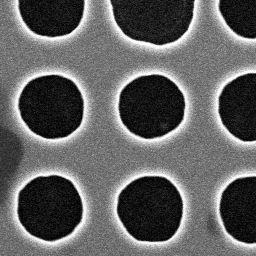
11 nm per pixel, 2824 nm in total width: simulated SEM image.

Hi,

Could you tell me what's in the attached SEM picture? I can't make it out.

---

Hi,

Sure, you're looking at holes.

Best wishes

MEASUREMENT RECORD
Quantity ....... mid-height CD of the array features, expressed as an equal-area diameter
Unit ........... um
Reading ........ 0.734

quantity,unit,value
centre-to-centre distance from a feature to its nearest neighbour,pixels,100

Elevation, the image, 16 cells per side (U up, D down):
UDDDDUUDDDDDUUDD
UUDDDUUDDDDDUUDD
UUUUUUUUDDDUUUUU
UUUUUUUUUUUUUUUU
UUUUUUUUUUUUUUUU
UDDDDUUUDDDUUUDD
UDDDDUUDDDDDUUDD
UDDDDUUUDDDUUUDD
UUDDUUUUUDUUUUUD
UUUUUUUUUUUUUUUU
UUUUUUUUUUUUUUUU
UUDDDUUUDDDUUUDD
UDDDDUUDDDDUUUDD
UDDDDUUDDDDUUUDD
UUDDDUUUDDDUUUDD
UUUUUUUUUUUUUUUU